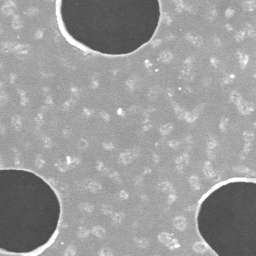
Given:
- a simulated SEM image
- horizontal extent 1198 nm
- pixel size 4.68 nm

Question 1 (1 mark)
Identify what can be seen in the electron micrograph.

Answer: holes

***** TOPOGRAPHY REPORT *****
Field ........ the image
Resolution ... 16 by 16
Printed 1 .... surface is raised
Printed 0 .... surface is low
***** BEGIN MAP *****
1111000000111111
1111000000111111
1111100001111111
1111111111111111
1111111111111111
1111111111111111
1111111111111111
1111111111111111
1111111111111111
1111111111111111
1111111111111111
0001111111111100
0000111111111000
0000111111110000
0001111111110000
0011111111111000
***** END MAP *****